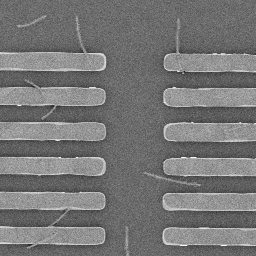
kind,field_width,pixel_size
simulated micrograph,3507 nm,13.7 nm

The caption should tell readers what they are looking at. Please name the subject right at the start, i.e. groups of lines, slits or small figures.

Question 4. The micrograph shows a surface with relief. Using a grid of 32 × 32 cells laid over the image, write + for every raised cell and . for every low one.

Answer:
................................
................................
................................
................................
................................
................................
..........+.....................
+++++++++++++........+++++++++++
+++++++++++++........+++++++++++
................................
................................
+++++++++++++........+++++++++++
+++++++++++++.......++++++++++++
................................
................................
+++++++++++++.........+++++..+++
+++++++++++++........+++++++++++
..........+++........+++++++++++
................................
................................
+++++++++++++.......++++++++++++
+++++++++++++........+++++++++++
................................
................................
+++++++++++++........+++++++++++
+++++++++++++.......++++++++++++
................................
................................
+++++++++++++........++.........
+++++++++++++.......++++++++++++
...++................+++++++++++
................................